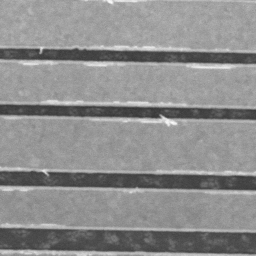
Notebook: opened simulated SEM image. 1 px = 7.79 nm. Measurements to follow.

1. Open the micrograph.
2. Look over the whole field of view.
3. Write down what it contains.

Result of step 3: one or a few lines or trenches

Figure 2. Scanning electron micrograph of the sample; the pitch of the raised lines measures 486 nm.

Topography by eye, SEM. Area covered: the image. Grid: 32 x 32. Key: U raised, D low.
UUUUUUUUUUUUUUUUUUUUUUUUUUUUUUUU
UUUUUUUUUUUUUUUUUUUUUUUUUUUUUUUU
UUUUUUUUUUUUUUUUUUUUUUUUUUUUUUUU
UUUUUUUUUUUUUUUUUUUUUUUUUUUUUUUU
UUUUUUUUUUUUUUUUUUUUUUUUUUUUUUUU
UUUUUUUUUUUUUUUUUUUUUUUUUUUUUUUU
DDDDDDDDDDDDDDDDDDDDDDDDDDDDDDDD
DDDDDDDDDDDDDDDDDDDDDDDDDDDDDDDD
UUUUUUUUUUUUUUUUUUUUUUUUUUUUUUUU
UUUUUUUUUUUUUUUUUUUUUUUUUUUUUUUU
UUUUUUUUUUUUUUUUUUUUUUUUUUUUUUUU
UUUUUUUUUUUUUUUUUUUUUUUUUUUUUUUU
UUUUUUUUUUUUUUUUUUUUUUUUUUUUUUUU
DDDDDDDDDDDDDDDDDDDDDDDDDDDDDDDU
DDDDDDDDDDDDDDDDDDDDDDDDDDDDDDDD
UUUUUUUUUUUUUUUUUUUUUUUUUUUUUUUU
UUUUUUUUUUUUUUUUUUUUUUUUUUUUUUUU
UUUUUUUUUUUUUUUUUUUUUUUUUUUUUUUU
UUUUUUUUUUUUUUUUUUUUUUUUUUUUUUUU
UUUUUUUUUUUUUUUUUUUUUUUUUUUUUUUU
UUUUUUUUUUUUUUUUUUUUUUUUUUUUUUUU
DDDDDDDDDDDDDDDUUUUUUUUUUUUUUUUU
DDDDDDDDDDDDDDDDDDDDDDDDDDDDDDDD
UUUUDDDDDDDDDDDDDDDDDDDDDDDDDDDD
UUUUUUUUUUUUUUUUUUUUUUUUUUUUUUUU
UUUUUUUUUUUUUUUUUUUUUUUUUUUUUUUU
UUUUUUUUUUUUUUUUUUUUUUUUUUUUUUUU
UUUUUUUUUUUUUUUUUUUUUUUUUUUUUUUU
DDDDDDDDDDDDUUUUUUUUUUUUUUUUUUUU
DDDDDDDDDDDDDDDDDDDDDDDDDDDDDDDD
DDDDDDDDDDDDDDDDDDDDDDDDDDDDDDDD
UUUUUUUUUDDDDDDDDDDDDDDDDDDDDDDD